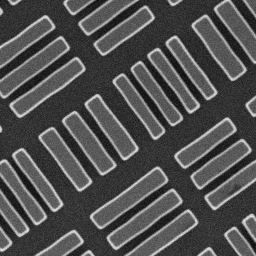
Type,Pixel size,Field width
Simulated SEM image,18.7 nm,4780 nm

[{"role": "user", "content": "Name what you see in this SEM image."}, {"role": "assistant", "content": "groups of lines, slits or small figures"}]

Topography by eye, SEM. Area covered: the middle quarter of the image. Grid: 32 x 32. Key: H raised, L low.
HHHHHLLLLLLLLLLLLLHHLLLHHHHLLHHH
HHHHHLLLLLLLLLLLLHHHHLLHHHHHLLHH
HHHHLLLLLLLLLLLLLLHHHLLLHHHHLLLH
HHHLLLLLLLLLLHHHLLHHHHLLLHHHHLLL
HLLLLLLLLLLLLHHHLLLHHHHLLLHHHHLL
LLLLLLLLLLLLLHHHHLLLHHHHLLLHHHLL
LLLLLLLLLLLLLLHHHHLLHHHHLLLLHHHL
LLLLLLLLLLLLLLLHHHHLLHHHHLLLHHHH
LLLLLLLHHLLLLLLHHHHLLLHHHHLLLHHH
LLLLLLHHHHLLLLLLHHHHLLLHHHLLLLHH
LLLLLLHHHHLLLLLLLHHHHLLHHHHLLLHH
LLLLLLHHHHHLLLLLLLHHHLLLHHHHLLLH
LLHLLLLHHHHHLLLLLLHHHHLLLHHHHLLL
HHHHLLLLHHHHHLLLLLLHHHHLLLHHHLLL
HHHHHLLLHHHHHHLLLLLLHHHLLLHHHLLL
LHHHHHLLLHHHHHLLLLLLLHHHLLLLLLLL
LHHHHHHLLLHHHHHLLLLLLHHHHLLLLLLL
LLHHHHHLLLHHHHHHLLLLLLHHHLLLLLLL
LLLHHHHHLLLHHHHHHLLLLLLLLLLLLLLL
LLLHHHHHHLLLHHHHHLLLLLLLLLLLLLLL
HLLLHHHHHLLLLHHHHHLLLLLLLLLLLLLH
HLLLLHHHHHLLLHHHHHLLLLLLLLLLLHHH
HHLLLLHHHHHLLLHHHLLLLLLLLLLLHHHH
HHHLLLHHHHHHLLLHLLLLLLLLLLLLHHHH
HHHLLLLHHHHHLLLLLLLLLLLLLLLLLHHH
HHHHLLLLHHHHHLLLLLLLLLLLLLLLLLHL
HHHHHLLLHHHLLLLLLLLLLLHHLLLLLLLL
LHHHHHLLLHLLLLLLLLLLLHHHHLLLLLLL
LHHHHHLLLLLLLLLLLLLLHHHHHHLLLLLL
LLHHHHHLLLLLLLLLLLHHHHHHHLLLLLLL
LLLHHHLLLLLLLLLLLHHHHHHHLLLLLLLL
LLLLLLLLLLLLLLLLHHHHHHHLLLLLLLLL